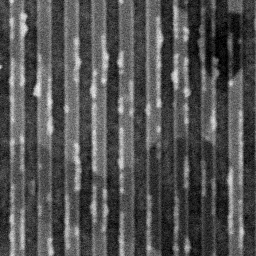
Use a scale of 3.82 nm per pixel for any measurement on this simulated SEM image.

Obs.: parallel lines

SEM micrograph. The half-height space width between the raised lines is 53.4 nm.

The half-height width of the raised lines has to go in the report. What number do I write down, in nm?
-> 50.1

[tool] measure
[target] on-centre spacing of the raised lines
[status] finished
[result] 104 nanometres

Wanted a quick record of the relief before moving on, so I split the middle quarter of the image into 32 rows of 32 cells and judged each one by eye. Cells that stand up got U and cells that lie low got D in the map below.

UUUUDDDUUUUDDDUUUDDDDUUUDDDDUUUD
UUUUDDDUUUUDDDUUUDDDDUUUDDDUUUUD
UUUDDDDUUUUDDDUUUDDDDUUUDDDUUUUD
UUUUDDDUUUUDDDUUUDDDDUUUDDDUUUUD
UUUUDDDUUUDDDDUUUDDDDUUUDDDUUUUD
UUUDDDDUUUDDDDUUUDDDDUUUDDDUUUUD
UUUDDDDUUUDDDDUUUDDDDUUUDDDDUUUD
UUUDDDDUUUDDDDUUUDDDDUUUDDDDUUUD
UUUDDDDUUUDDDDUUUDDDDUUUDDDDUUUD
UUUDDDDUUUDDDDUUUDDDDUUUDDDDUUUD
UUUDDDDUUUDDDDUUUDDDDUUUDDDDUUUD
UUUDDDDUUUDDDDUUUDDDUUUUDDDDUUUD
UUUDDDDUUUDDDDUUUDDDDUUUDDDDUUUD
UUUDDDDUUUDDDDUUUDDDDUUUDDDDUUUD
UUUDDDDUUUDDDDUUUDDDDUUUDDDDUUUD
UUUDDDDUUUDDDDUUUDDDDUUUDDDDUUUD
UUUDDDDUUUDDDDUUUDDDDUUUDDDDUUUD
UUUDDDDUUUDDDDUUUDDDDUUUDDDDUUUD
UUUDDDDUUUDDDDUUUDDDDUUUDDDDUUUD
UUUDDDDUUUDDDDUUUDDDDUUUDDDDUUUD
UUUUDDDUUUDDDDUUUDDDDUUUDDDDUUUD
UUUUDDDUUUDDDDUUUDDDDUUUDDDDUUUD
UUUDDDDUUUDDDDUUUDDDDUUUDDDDUUUD
UUUUDDDUUUDDDDUUUDDDDUUUDDDDUUUD
UUUUDDDUUUDDDDUUUDDDDUUUDDDDUUUD
UUUUDDDUUUDDDDUUUDDDDUUUDDDDUUUD
UUUUDDDUUUDDDDUUUDDDDUUUDDDDUUUD
UUUUDDDUUUDDDDUUUDDDDUUUDDDDUUUD
UUUUDDDUUUDDDDUUUDDDDUUUDDDDUUUD
UUUUDDDUUUDDDDUUUDDDDUUUDDDDUUUD
UUUUDDDUUUDDDDUUUDDDDUUUDDDDUUUD
UUUUDDDUUUDDDDUUUDDDDUUUDDDDUUUD